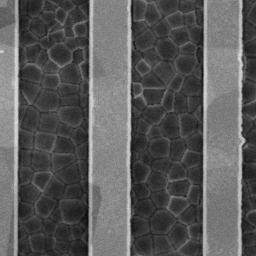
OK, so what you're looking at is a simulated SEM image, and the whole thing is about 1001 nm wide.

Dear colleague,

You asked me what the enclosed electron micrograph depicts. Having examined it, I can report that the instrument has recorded one or a few lines or trenches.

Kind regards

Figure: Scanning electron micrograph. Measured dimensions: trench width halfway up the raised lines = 0.291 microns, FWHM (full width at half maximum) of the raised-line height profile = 150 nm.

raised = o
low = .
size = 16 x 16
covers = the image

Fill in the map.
o.....oo.....oo.
o.....oo.....oo.
o.....oo.....oo.
o.....oo.....oo.
o.....oo.....oo.
o.....oo.....oo.
o.....oo.....oo.
o.....oo.....oo.
o.....oo.....oo.
o.....oo.....oo.
o.....oo.....oo.
o.....oo.....oo.
o.....oo.....oo.
o.....oo.....oo.
o.....oo.....oo.
o.....oo.....oo.